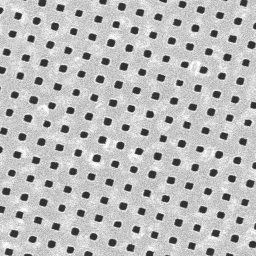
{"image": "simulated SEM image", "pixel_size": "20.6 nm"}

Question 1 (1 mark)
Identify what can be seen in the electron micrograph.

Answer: a regular array of holes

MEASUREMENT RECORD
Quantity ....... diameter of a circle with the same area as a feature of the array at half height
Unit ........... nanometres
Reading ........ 174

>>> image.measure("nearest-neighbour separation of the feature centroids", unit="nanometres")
389